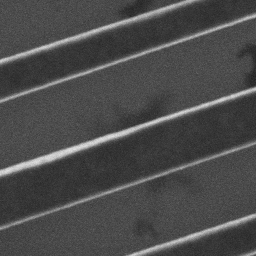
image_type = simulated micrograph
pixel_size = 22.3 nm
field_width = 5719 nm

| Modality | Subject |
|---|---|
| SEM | lines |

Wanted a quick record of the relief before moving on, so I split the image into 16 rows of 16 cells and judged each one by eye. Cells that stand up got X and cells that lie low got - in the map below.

----------XXXXXX
-------XXXXXXXX-
----XXXXXXXX----
-XXXXXXXX-------
XXXXXX----------
XXX-------------
-------------XXX
----------XXXXXX
-------XXXXXXXXX
----XXXXXXXXXX--
-XXXXXXXXXX-----
XXXXXXXX--------
XXXXX-----------
XXX-------------
-------------XXX
---------XXXXXXX